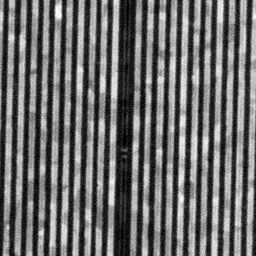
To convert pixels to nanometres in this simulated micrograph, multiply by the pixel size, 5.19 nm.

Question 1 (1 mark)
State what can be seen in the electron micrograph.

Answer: parallel lines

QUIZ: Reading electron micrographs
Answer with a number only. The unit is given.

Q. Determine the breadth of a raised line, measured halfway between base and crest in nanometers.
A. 24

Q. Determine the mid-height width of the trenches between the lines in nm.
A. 38.9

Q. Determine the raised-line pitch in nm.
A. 60.1